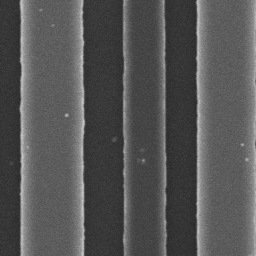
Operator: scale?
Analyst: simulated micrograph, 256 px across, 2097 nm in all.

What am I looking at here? lines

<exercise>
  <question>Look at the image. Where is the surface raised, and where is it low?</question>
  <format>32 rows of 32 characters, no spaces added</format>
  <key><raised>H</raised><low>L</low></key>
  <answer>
LLLHHHHHHHLLLLLHHHHHLLLLLHHHHHHH
LLLHHHHHHHLLLLLHHHHHLLLLLHHHHHHH
LLLHHHHHHHLLLLLHHHHHHLLLLHHHHHHH
LLLHHHHHHHLLLLLHHHHHHLLLLHHHHHHH
LLLHHHHHHHLLLLLHHHHHHLLLLHHHHHHH
LLLHHHHHHHLLLLLHHHHHHLLLLHHHHHHH
LLLHHHHHHHLLLLLHHHHHHLLLLHHHHHHH
LLLHHHHHHHLLLLLLHHHHHLLLLHHHHHHH
LLLHHHHHHHLLLLLLHHHHHLLLLHHHHHHH
LLLHHHHHHHLLLLLHHHHHHLLLLHHHHHHH
LLLHHHHHHHLLLLLHHHHHHLLLLHHHHHHH
LLLHHHHHHHLLLLLHHHHHHLLLLHHHHHHH
LLLHHHHHHHLLLLLHHHHHHLLLLHHHHHHH
LLLHHHHHHHLLLLLHHHHHHLLLLHHHHHHH
LLLHHHHHHHLLLLLHHHHHHLLLLHHHHHHH
LLLHHHHHHHHLLLLHHHHHHLLLLHHHHHHH
LLLHHHHHHHLLLLLHHHHHHLLLLHHHHHHH
LLLHHHHHHHLLLLLLHHHHHLLLLHHHHHHH
LLLHHHHHHHLLLLLHHHHHHLLLLHHHHHHH
LLLHHHHHHHLLLLLHHHHHHLLLLHHHHHHH
LLLHHHHHHHLLLLLLHHHHHLLLLHHHHHHH
LLLHHHHHHHLLLLLHHHHHHLLLLHHHHHHH
LLLHHHHHHHLLLLLLHHHHHLLLLHHHHHHH
LLLHHHHHHHLLLLLLHHHHHLLLLHHHHHHH
LLLHHHHHHHLLLLLLHHHHHLLLLHHHHHHH
LLLHHHHHHHLLLLLLHHHHHLLLLHHHHHHH
LLLHHHHHHHLLLLLLHHHHHLLLLHHHHHHH
LLLHHHHHHHLLLLLLHHHHHLLLLHHHHHHH
LLLHHHHHHHLLLLLLHHHHHLLLLHHHHHHH
LLLHHHHHHHLLLLLHHHHHHLLLLHHHHHHH
LLLHHHHHHHLLLLLHHHHHHLLLLHHHHHHH
LLLHHHHHHHLLLLLLHHHHHLLLLHHHHHHH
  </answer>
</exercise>